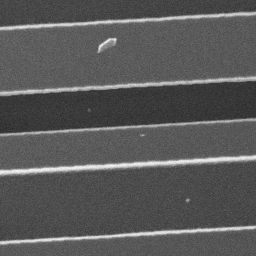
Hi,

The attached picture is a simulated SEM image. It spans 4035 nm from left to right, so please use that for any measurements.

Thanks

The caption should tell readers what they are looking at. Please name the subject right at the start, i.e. lines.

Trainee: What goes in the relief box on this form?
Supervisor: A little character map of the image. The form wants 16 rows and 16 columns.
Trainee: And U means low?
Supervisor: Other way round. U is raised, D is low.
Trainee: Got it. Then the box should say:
DDDDDDDDDDDDDDDD
DDDDDUUUUUUUUUUU
UUUUUUUUUUUUUUUU
UUUUUUUUUUUUUUUU
UUUUUUUUUUUUUUUU
UUUUUUDDDDDDDDDD
DDDDDDDDDDDDDDDD
DDDDDDDDDDDDDDDD
UUUUUUUUUUUUUUUU
UUUUUUUUUUUUUUUU
UUUUDDDDDDDDDDDD
DDDDDDDDDDDDDDDD
DDDDDDDDDDDDDDDD
DDDDDDDDDDDDDDDD
DDDDDDDDDDDUUUUU
UUUUUUUUUUUUUUUU